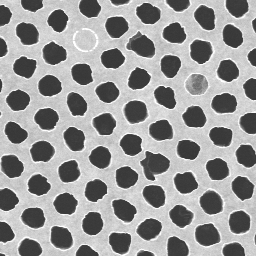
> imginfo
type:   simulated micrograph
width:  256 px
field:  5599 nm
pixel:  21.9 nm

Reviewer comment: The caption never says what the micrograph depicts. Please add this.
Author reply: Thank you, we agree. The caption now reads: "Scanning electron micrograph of a regular array of holes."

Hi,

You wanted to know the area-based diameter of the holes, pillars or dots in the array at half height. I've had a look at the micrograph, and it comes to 487 nm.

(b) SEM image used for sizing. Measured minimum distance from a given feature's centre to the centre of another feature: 705 nm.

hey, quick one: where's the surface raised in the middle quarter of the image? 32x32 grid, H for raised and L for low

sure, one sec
HHLLLLHHHHLLLLHHHHHHHHHHLLLLLHHH
HHLLLLLHHHHHHHHHHLLLHHHHLLLLLHHH
HHLLLLLHHHHHHHHHHLLLLHHHHLLLHHHH
HHLLLLLHHHHHHHHHLLLLLLHHHHLHHHHH
HHHLLLLHHHHLHHHHLLLLLHHHHHHHHHHH
HHHHHHHHHLLLLHHHLLLLHHHHLHHHHHHH
HHHHHHHHLLLLLLHHHHHHHHHLLLLHHHHH
HLLLHHHHLLLLLLHHHHHHHHLLLLLLHHHH
HLLLLHHHHLLLLHHHHHHHHHHLLLLLHHHH
HLLLLLHHHHLLHHHHLLLLHHHLLLLLHHHH
HLLLLLHHHHHHHHHLLLLLLHHHHLLLHHHH
HLLLLLHHHHHHHHHLLLLLLHHHHHHHHHHL
HHLLLHHHHHLLHHHLLLLLLHHHHHHHHHLL
HHHHHHHHLLLLHHHHLLLLHHHHHHHHHHLL
HHHHHHHLLLLLLHHHLLLHHHHLLLHHHHLL
HHHHHHHLLLLLLHHHHHHHHLLLLLLHHHHL
HLLLHHHHLLLLHHHHHHHHHLLLLLLHHHHH
LLLLLHHHHLLLHHHHLHHHHHLLLLLHHHHH
LLLLLHHHHHHHHHHLLLLHHHLLLLLHHHHH
LLLLLHHHHHHHHHLLLLLHHHHHHHHHHLLL
HLLLLHHHHHHHHHLLLLLHHHHHHHHHLLLL
HHLLHHHLLLLHHHHLLLLHHHHHHHHHLLLL
HHHHHHHLLLLLHHHHLLHHLLLLHHHHHLLL
HHHHHHLLLLLLHHHHHHHHLLLLLLHHHLLL
LLLHHHHLLLLHHHHHHHHLLLLLLLHHHHHH
LLLHHHHHLLLHHHHHHHHLLLLLLLHHHHHH
LLLLHHHHHHHHHLLLLHHHLLLLLLHHHHHH
LLLLHHHHHHHHHLLLLLLHLLLLHHHHLLLL
LLLHHHHHHHHHHLLLLLLHHLLHHHHHLLLL
LLHHHHLLLLHHHLLLLLHHHHHHHHHLLLLL
HHHHHHLLLLLHHHLLLHHHHLLLHHHHLLLL
HHHHHLLLLLLHHHHHHHHHLLLLLHHHLLLL